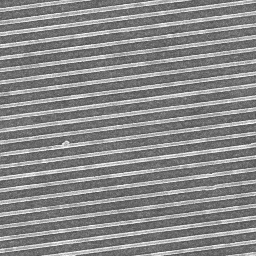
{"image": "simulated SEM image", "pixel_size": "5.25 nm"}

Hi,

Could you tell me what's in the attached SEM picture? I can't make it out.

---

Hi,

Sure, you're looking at parallel lines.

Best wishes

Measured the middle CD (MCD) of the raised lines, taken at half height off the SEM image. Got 3.47 px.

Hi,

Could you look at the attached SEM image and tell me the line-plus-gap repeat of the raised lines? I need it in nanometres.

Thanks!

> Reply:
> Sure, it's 62.6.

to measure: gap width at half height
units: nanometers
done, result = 44.9